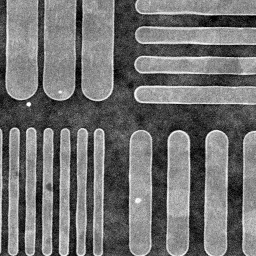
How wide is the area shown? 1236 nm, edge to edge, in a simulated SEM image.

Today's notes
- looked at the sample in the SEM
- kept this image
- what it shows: groups of lines, slits or small figures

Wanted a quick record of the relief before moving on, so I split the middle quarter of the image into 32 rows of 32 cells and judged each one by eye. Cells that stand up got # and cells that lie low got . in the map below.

###..#######......##############
###..#######......##############
###..#######....................
###..#######....................
###..#######....................
###..#######....................
###..#######......##############
##...#######......##############
#.....#####.......##############
...................#############
................................
................................
................................
................................
................................
................................
#...#...#.......................
#...##..##.......####......###..
#..###..##.......#####....#####.
#..###..##.......#####....#####.
#..###..##.......#####....#####.
#..###..##.......#####....#####.
#..###..##.......#####....#####.
#..###..##.......#####....#####.
#..###..##.......#####....#####.
#..###..##.......#####....#####.
#..###..##......######....#####.
#..###..##......######....#####.
#..###..##......######....#####.
#..###..##......######....#####.
#..##...##......######....#####.
#..##...##......######....#####.